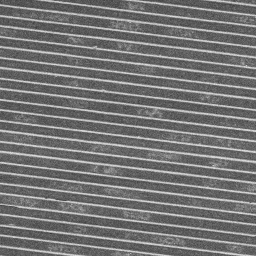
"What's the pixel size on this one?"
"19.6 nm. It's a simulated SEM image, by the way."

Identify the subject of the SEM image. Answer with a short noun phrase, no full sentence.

parallel lines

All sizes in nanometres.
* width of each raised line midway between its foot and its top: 187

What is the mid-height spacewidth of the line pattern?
219 nm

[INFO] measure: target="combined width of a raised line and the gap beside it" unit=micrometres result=0.407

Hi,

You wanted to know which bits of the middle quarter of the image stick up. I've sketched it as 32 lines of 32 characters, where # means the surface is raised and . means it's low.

.......................#########
########.......................#
#################...............
......###################.......
...............#################
.....................###########
######........................##
###############.................
....###################.........
.............##################.
.....................###########
####.........................###
#############...................
.####################...........
.........####################...
.................###############
##.......................#######
###########.....................
###################.............
.......####################.....
...............#################
.......................#########
#########......................#
#################...............
.....####################.......
...............#################
.......................#########
#######........................#
###############.................
.....##################.........
.............##################.
.....................###########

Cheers